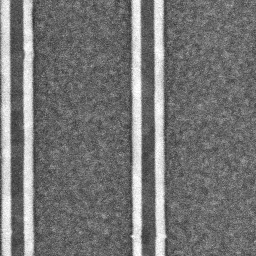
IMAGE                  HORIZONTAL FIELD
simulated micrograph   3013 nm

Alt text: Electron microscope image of one or a few lines or trenches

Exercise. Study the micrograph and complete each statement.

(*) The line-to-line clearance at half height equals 1.28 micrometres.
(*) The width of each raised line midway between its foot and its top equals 255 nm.